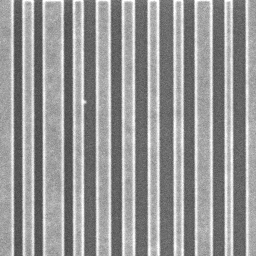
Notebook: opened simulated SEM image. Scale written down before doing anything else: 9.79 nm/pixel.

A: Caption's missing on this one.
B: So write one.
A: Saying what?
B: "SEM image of groups of lines, slits or small figures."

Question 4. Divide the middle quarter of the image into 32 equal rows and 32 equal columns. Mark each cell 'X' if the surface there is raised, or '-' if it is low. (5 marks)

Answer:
--XXX---XXX----XXX---XXX----XX--
--XXX---XXX----XXX---XXX----XX--
--XXX---XXXX---XXX---XXX----XX--
--XXX---XXXX---XXX---XXX----XX--
--XXX---XXXX---XXX---XXX----XX--
--XXX---XXXX---XXX---XXX----XX--
--XXX---XXXX---XXX---XXX----XX--
--XXX---XXXX---XXX---XXX----XX--
--XXX---XXXX---XXX---XXX----XX--
--XXX---XXXX---XXX---XXX----XX--
--XXX---XXXX---XXX---XXX----XX--
--XXX---XXXX---XXX---XXX----XX--
--XXX---XXXX---XXX---XXX----XX--
--XXX---XXXX---XXX---XXX----XX--
--XXX---XXXX---XXX---XXX----XX--
--XXX---XXXX---XXX---XXX----XX--
--XXX---XXXX---XXX---XXX----XX--
--XXX---XXXX---XXX---XXX----XX--
--XXX---XXXX---XXX---XXX----XX--
--XXX---XXXX---XXX---XXX----XX--
--XXX---XXXX---XXX---XXX----XX--
--XXX---XXXX---XXX---XXX----XX--
--XXX---XXXX---XXX---XXX----XX--
--XXX---XXXX---XXX---XXX----XX--
--XXX---XXXX---XXX---XXX----XX--
--XXX---XXXX---XXX---XXX----XX--
--XXX---XXXX---XXX---XXX----XX--
--XXX---XXXX---XXX---XXX----XX--
--XXX---XXXX---XXX---XXX----XX--
--XXX---XXXX---XXX---XXX----XX--
--XXX---XXXX---XXX---XXX----XX--
--XXX---XXXX---XXX---XXX----XX--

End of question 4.